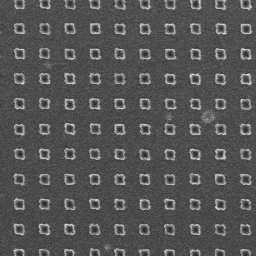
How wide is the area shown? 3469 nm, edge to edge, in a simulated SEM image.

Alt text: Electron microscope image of a regular array of raised bodies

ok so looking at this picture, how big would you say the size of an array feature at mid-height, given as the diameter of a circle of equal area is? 148 nm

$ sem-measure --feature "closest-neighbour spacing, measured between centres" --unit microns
0.336